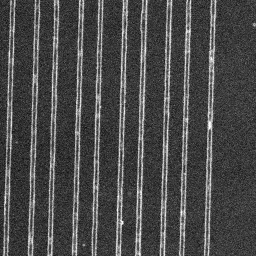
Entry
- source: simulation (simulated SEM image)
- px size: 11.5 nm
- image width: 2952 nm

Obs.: parallel lines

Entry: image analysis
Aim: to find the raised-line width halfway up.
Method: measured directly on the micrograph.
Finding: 46.1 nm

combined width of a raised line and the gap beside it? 0.257 micrometres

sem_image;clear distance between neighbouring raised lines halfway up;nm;230